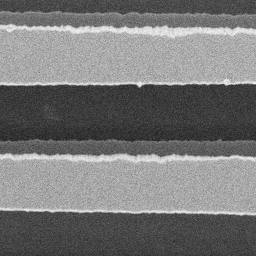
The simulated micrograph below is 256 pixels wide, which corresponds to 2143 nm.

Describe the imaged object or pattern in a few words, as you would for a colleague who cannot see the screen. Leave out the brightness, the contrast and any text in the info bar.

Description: lines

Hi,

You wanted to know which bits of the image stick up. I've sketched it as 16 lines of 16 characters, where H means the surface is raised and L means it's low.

LLLLLLLLLLLLLLLL
HHHHHHHHHHHHHHHH
HHHHHHHHHHHHHHHH
HHHHHHHHHHHHHHHH
HHHHHHHHHHHHHHHH
LLLLLLLLLLLLLLLL
LLLLLLLLLLLLLLLL
LLLLLLLLLLLLLLLL
LLLLLLLLLLLLLLLL
HHHHHHHHHHHHHHHH
HHHHHHHHHHHHHHHH
HHHHHHHHHHHHHHHH
HHHHHHHHHHHHHHHH
LLLLLLLLLLLLLLLL
LLLLLLLLLLLLLLLL
LLLLLLLLLLLLLLLL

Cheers